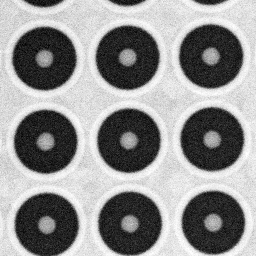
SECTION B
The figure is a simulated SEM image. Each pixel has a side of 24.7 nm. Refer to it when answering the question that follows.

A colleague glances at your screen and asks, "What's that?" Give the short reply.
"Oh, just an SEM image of an array of small figures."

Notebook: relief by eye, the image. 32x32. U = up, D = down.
UUUDDDDDUUUUUUDDDDUUUUUUDDDDDUUU
UUUUUUUUUUUUUUUUUUUUUUUUUUUUUUUU
UUUUUUUUUUUUUUUUUUUUUUUUUUUUUUUU
UUUDDDDDUUUUUUDDDDDUUUUUDDDDDUUU
UUDDDDDDDUUUDDDDDDDDUUUDDDDDDDUU
UUDDDDDDDDUUDDDDDDDDUUDDDDDDDDDU
UDDDDDDDDDUUDDDDDDDDUUDDDDDDDDDU
UDDDDUDDDDUUDDDDDDDDUUDDDDDDDDDU
UDDDDDDDDDUUDDDDDDDDUUDDDDDDDDDU
UUDDDDDDDUUUDDDDDDDDUUUDDDDDDDUU
UUUDDDDDDUUUUDDDDDDUUUUUDDDDDUUU
UUUUDDDUUUUUUUUDDUUUUUUUUUDUUUUU
UUUUUUUUUUUUUUUUUUUUUUUUUUUUUUUU
UUUUDDDUUUUUUUDDDDUUUUUUDDDDDUUU
UUUDDDDDDUUUUDDDDDDUUUUDDDDDDDUU
UUDDDDDDDDUUDDDDDDDDUUUDDDDDDDUU
UDDDDDDDDDUUDDDDDDDDUUDDDDDDDDDU
UDDDDUDDDDUUDDDDUDDDDUDDDDUDDDDU
UDDDDDDDDDUUDDDDDDDDUUDDDDDDDDDU
UUDDDDDDDDUUDDDDDDDDUUUDDDDDDDUU
UUDDDDDDDUUUUDDDDDDUUUUDDDDDDDUU
UUUDDDDDUUUUUUDDDDUUUUUUUDDDUUUU
UUUUUUUUUUUUUUUUUUUUUUUUUUUUUUUU
UUUUUUUUUUUUUUUUUUUUUUUUUUDUUUUU
UUUDDDDDDUUUUUDDDDDUUUUUDDDDDDUU
UUDDDDDDDUUUUDDDDDDDUUUDDDDDDDUU
UUDDDDDDDDUUDDDDDDDDUUDDDDDDDDDU
UDDDDDDDDDUUDDDDDDDDDUDDDDDDDDDU
UDDDDDDDDDUUDDDDDDDDDUDDDDDDDDDU
UUDDDDDDDDUUDDDDDDDDUUUDDDDDDDDU
UUDDDDDDDDUUUDDDDDDDUUUDDDDDDDUU
UUUDDDDDDUUUUDDDDDDUUUUUDDDDDUUU